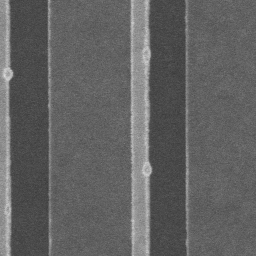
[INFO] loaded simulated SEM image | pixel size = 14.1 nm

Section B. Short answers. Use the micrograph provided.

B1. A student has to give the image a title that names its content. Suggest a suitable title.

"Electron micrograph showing lines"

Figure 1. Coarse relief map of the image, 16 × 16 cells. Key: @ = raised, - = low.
---@@@@@@---@@@@
---@@@@@@---@@@@
---@@@@@@---@@@@
---@@@@@@---@@@@
@--@@@@@@---@@@@
---@@@@@@---@@@@
---@@@@@@---@@@@
@--@@@@@@---@@@@
@--@@@@@@---@@@@
@--@@@@@@---@@@@
@--@@@@@@---@@@@
@--@@@@@@---@@@@
@--@@@@@@---@@@@
@--@@@@@@---@@@@
@--@@@@@@---@@@@
@--@@@@@@---@@@@